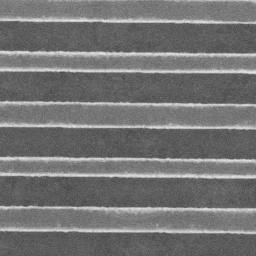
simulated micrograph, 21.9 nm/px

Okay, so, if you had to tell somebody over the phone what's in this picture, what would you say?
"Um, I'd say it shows lines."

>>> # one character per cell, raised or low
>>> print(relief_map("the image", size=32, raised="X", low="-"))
XXXXXXXXXXXXXXXXXXXXXXXXXXXXXXXX
XXXXXXXXXXXXXXXXXXXXXXXXXXXXXXXX
XXXXXXXXXXXXXXXXXXXXXXXXXXXXXXXX
--------------------------------
--------------------------------
--------------------------------
X-XX----------------------------
XXXXXXXXXXXXXXXXXXXXXXXXXXXXXXXX
XXXXXXXXXXXXXXXXXXXXXXXXXXXXXXXX
--------------------------------
--------------------------------
--------------------------------
--------------------------------
XXXXXXXXXXXXXXXXXXXXXXXXXXXXXXXX
XXXXXXXXXXXXXXXXXXXXXXXXXXXXXXXX
XXXXXXXXXXXXXXXXXXXXXXXXXXXXXXXX
--------------------------------
--------------------------------
--------------------------------
--------------------------------
XXXXXXXXXXXXXXXXXXXXXXXXXXXXXXXX
XXXXXXXXXXXXXXXXXXXXXXXXXXXXXXXX
--------------------------------
--------------------------------
--------------------------------
--------------------------------
XXXXXXXXXXXXXXXXXXXXXXXXXXXXXXXX
XXXXXXXXXXXXXXXXXXXXXXXXXXXXXXXX
XXXXXXXXXXXXXXXXXXXXXXXXXXXXXXXX
--------------------------------
--------------------------------
--------------------------------